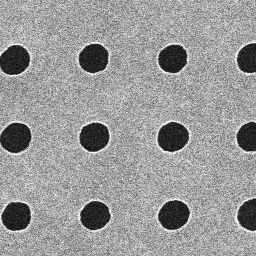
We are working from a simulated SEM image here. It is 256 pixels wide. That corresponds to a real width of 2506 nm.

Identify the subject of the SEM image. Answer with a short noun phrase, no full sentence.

holes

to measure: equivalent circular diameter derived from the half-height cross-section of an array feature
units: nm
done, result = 293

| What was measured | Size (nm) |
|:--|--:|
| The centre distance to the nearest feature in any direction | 767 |